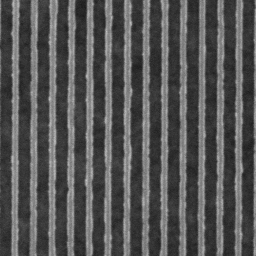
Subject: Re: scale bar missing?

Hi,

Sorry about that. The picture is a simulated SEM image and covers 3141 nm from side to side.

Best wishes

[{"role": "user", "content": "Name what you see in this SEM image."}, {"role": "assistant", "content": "parallel lines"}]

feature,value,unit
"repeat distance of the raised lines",228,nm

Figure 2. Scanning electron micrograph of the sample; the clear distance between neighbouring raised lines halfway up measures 164 nanometres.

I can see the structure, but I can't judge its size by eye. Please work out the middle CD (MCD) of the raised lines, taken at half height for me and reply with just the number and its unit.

58.3 nanometers